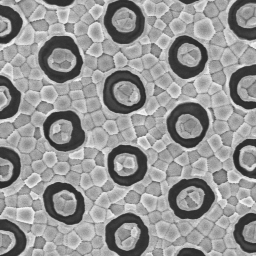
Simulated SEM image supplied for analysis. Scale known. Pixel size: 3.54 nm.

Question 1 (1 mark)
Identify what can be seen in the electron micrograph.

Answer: a regular array of ring-shaped grooves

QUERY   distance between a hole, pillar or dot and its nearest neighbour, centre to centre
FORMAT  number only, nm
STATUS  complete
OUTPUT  247